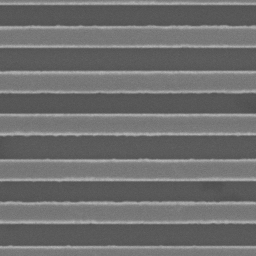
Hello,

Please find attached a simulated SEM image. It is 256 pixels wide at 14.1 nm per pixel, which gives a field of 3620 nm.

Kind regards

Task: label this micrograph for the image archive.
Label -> lines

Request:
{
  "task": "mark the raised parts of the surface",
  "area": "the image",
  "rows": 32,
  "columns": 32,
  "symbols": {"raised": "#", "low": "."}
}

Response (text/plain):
################################
................................
................................
################################
################################
################################
................................
................................
................................
################################
################################
############.##############.####
................................
................................
################################
################################
################################
................................
................................
................................
################################
################################
################################
................................
................................
################################
################################
################################
................................
................................
................................
################################